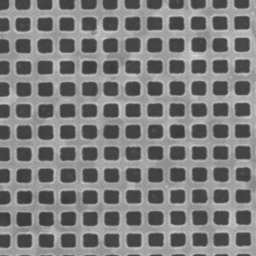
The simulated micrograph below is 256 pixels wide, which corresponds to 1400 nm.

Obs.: a regular array of holes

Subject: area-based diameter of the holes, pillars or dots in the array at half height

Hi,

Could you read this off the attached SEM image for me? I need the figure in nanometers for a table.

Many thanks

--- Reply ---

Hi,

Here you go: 93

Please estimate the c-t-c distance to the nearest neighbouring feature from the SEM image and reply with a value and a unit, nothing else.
117 nm